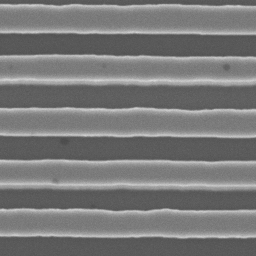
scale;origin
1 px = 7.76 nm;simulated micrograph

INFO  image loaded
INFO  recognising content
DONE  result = lines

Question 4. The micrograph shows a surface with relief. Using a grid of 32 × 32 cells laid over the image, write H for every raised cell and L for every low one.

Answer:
LLLLLLLLLLLLLLLLLLLLLLLLLLLLLLLL
HHHHHHHHHHHHHHHHHHHHHHHHHHHHHHHH
HHHHHHHHHHHHHHHHHHHHHHHHHHHHHHHH
HHHHHHHHHHHHHHHHHHHHHHHHHHHHHHHH
LLLLLLLLLLLLLLLLLLLLLLLLLLLLLLLL
LLLLLLLLLLLLLLLLLLLLLLLLLLLLLLLL
LLLLLLLLLLLLLLLLLLLLLLLLLLLLLLLL
HHHHHHHHHHHHHHHHHHHHHHHHHHHHHHHH
HHHHHHHHHHHHHHHHHHHHHHHHHHHHHHHH
HHHHHHHHHHHHHHHHHHHHHHHHHHHHHHHH
LLLLLLLLLLLLLLLLLLLLLLLLLLLLLLLL
LLLLLLLLLLLLLLLLLLLLLLLLLLLLLLLL
LLLLLLLLLLLLLLLLLLLLLLLLLLLLLLLL
LLLLHLLLHLLLLLLLHHLLLLLLLLLLLLLL
HHHHHHHHHHHHHHHHHHHHHHHHHHHHHHHH
HHHHHHHHHHHHHHHHHHHHHHHHHHHHHHHH
HHHHHHHHHHHHHHHHHHHHHHHHHHHHHHHH
LLLLLLLLLLLLLLLLLLLLLLLLLLLLLLLL
LLLLLLLLLLLLLLLLLLLLLLLLLLLLLLLL
LLLLLLLLLLLLLLLLLLLLLLLLLLLLLLLL
HHHHHHHHHHHHHHHHHHHHHHHHHHHHHHHH
HHHHHHHHHHHHHHHHHHHHHHHHHHHHHHHH
HHHHHHHHHHHHHHHHHHHHHHHHHHHHHHHH
LLLLLLLLLLLLLLLLLLLLLLLLLLLLLLLL
LLLLLLLLLLLLLLLLLLLLLLLLLLLLLLLL
LLLLLLLLLLLLLLLLLLLLLLLLLLLLLLLL
HHHHHHHHHHHHHHHHHHHHHHHHHHHHHHHH
HHHHHHHHHHHHHHHHHHHHHHHHHHHHHHHH
HHHHHHHHHHHHHHHHHHHHHHHHHHHHHHHH
LLLLLLLLLHHHHHHHHHHLHHHHHHHHHHHH
LLLLLLLLLLLLLLLLLLLLLLLLLLLLLLLL
LLLLLLLLLLLLLLLLLLLLLLLLLLLLLLLL